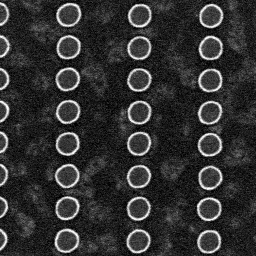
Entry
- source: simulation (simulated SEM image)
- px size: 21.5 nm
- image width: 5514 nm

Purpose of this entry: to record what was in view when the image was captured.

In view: a regular array of raised bodies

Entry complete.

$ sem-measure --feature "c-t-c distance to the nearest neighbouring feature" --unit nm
690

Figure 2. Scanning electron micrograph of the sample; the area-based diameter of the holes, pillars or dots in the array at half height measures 484 nanometers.